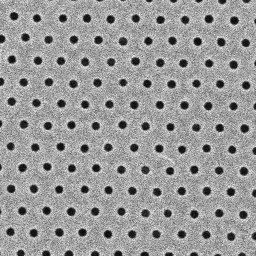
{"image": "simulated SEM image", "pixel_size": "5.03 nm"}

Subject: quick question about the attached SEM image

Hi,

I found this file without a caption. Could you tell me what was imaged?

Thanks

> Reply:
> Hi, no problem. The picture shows a regular array of holes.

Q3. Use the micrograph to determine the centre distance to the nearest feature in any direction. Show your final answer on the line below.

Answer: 119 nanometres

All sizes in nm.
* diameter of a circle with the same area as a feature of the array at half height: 41.3